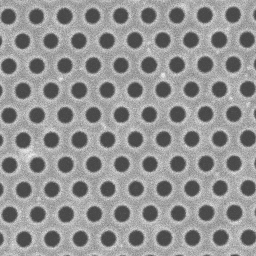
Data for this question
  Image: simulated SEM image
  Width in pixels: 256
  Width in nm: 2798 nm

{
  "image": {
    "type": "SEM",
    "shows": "a regular array of holes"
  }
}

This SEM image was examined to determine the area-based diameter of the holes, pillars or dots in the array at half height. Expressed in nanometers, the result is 180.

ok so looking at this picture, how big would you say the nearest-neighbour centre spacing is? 0.305 µm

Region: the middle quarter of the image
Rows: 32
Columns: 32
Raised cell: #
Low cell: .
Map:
..###....###....###....###....##
..###....####...###....####...##
################################
################################
###.####################..#####.
##....###....###....###....###..
##....###....###....###....###..
##....###....###...####....###..
###..#####..#####.######.#######
################################
############################.###
..####...####...####...####...##
..###....###....###....###.....#
..###....###....####...###....##
..####..#####...####..######.###
################################
################################
##...####...####....###...####..
##....###....###....###....###..
##....###....###....###....###..
##...#####..#####..#####..#####.
################################
################################
..####...####...####...####...##
...##....####...####...####....#
...##....####...####...####....#
..####...####...####...####...##
################################
################################
###..#####..#####..#####..#####.
##....###....###....###....###..
##....###....###....###....###..